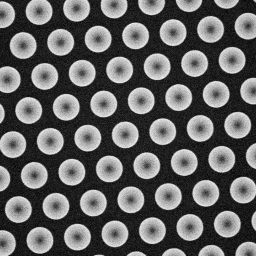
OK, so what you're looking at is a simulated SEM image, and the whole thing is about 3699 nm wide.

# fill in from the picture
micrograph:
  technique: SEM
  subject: an array of small figures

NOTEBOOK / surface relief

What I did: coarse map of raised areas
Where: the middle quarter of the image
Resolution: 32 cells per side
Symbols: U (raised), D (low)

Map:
DDUUUUUDDDDUUUUUUDDDUUUUUUDDDDUU
DUUUUUUUDDDUUUUUUDDDUUUUUUDDDDUU
DUUUUUUUDDDUUUUUUDDDDUUUUUDDDDDU
DDUUUUUUDDDUUUUUUDDDDDUUUDDDDDDD
DDUUUUUDDDDDDUUDDDDDDDDDDDDDDDDD
DDDDDDDDDDDDDDDDDDDDDDDDDDDDUUDD
DDDDDDDDDDDDDDDDDDUUUDDDDDUUUUUD
DDDDDDDDUUUUDDDDDUUUUUDDDDUUUUUU
UUUDDDDUUUUUUDDDUUUUUUDDDUUUUUUU
UUUDDDDUUUUUUDDDUUUUUUDDDDUUUUUU
UUUUDDDUUUUUUDDDUUUUUUDDDDUUUUUD
UUUUDDDUUUUUUDDDDUUUUUDDDDDDUUDD
UUUDDDDDUUUUDDDDDDDDDDDDDDDDDDDD
UUDDDDDDDDDDDDDDDDDDDDDDDDDDDDDD
DDDDDDDDDDDDDDDDDDDDDDUUUUUDDDDU
DDDDDUUDDDDDDUUUUUDDDDUUUUUUDDDU
DDDUUUUUUDDDUUUUUUDDDDUUUUUUDDDU
DDDUUUUUUDDDUUUUUUDDDDUUUUUUDDDU
DDDUUUUUUDDDUUUUUUDDDDUUUUUDDDDD
DDDUUUUUUDDDDUUUUUDDDDDUUUDDDDDD
DDDUUUUUUDDDDDUUUDDDDDDDDDDDDDDD
DDDDDUUDDDDDDDDDDDDDDDDDDDDDDUUD
DDDDDDDDDDDDDDDDDDDDUUDDDDDDUUUU
DDDDDDDDDDUUUDDDDDUUUUUDDDDUUUUU
UUUUDDDDDUUUUUDDDDUUUUUUDDDUUUUU
UUUUUDDDUUUUUUDDDDUUUUUUDDDUUUUU
UUUUUDDDUUUUUUUDDDUUUUUUDDDDUUUU
UUUUUDDDUUUUUUDDDDUUUUUDDDDDUUUU
UUUUUDDDDUUUUUDDDDDDUUDDDDDDDDDD
UUUUDDDDDDDDDDDDDDDDDDDDDDDDDDDD
DDDDDDDDDDDDDDDDDDDDDDDDUUUUDDDD
DDDDDDDDDDDDDDDUUUUDDDDUUUUUUDDD